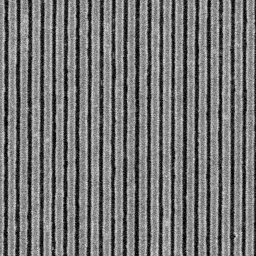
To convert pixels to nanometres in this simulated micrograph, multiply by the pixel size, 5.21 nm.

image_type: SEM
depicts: parallel lines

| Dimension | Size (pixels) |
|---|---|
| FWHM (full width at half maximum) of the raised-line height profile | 6.89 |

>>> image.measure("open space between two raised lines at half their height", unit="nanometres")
25.4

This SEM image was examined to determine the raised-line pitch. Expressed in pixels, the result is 11.9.